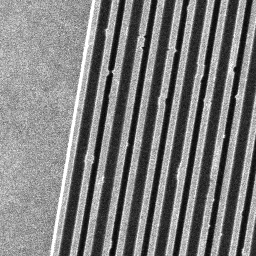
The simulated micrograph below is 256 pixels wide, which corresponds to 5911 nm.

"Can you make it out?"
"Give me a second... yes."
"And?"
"parallel lines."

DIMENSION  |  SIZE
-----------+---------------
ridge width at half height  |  185 nm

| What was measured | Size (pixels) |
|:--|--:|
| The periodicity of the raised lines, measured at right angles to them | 15.7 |